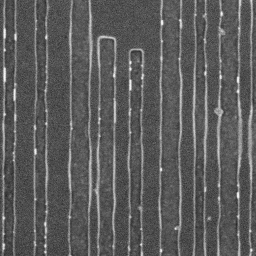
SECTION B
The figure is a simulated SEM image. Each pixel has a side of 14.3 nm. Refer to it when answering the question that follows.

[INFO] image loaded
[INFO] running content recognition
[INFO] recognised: groups of lines, slits or small figures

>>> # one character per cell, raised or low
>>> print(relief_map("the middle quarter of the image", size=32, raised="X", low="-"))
XX-----XX----XXX----XXXX-----XXX
XX-----XX----XXX----XXXX-----XXX
XX----XXX----XXX----XXXX-----XXX
XX----XXX----XXX----XXXX-----XXX
XX----XXX----XXX----XXXX-----XXX
XX----XXX----XXX----XXXX-----XXX
XX----XXX----XXX----XXXX-----XXX
XX----XXX----XXX---XXXXX-----XXX
XX----XXX----XXX----XXXX-----XXX
XX----XXX----XXX----XXXX-----XXX
XX----XXX----XXX---XXXXX-----XXX
XX----XXX----XXX---XXXXX-----XXX
XX----XXX----XXX---XXXXX-----XXX
XX----XXX----XXX---XXXXX-----XXX
XX----XXX----XXX---XXXXX-----XXX
XX----XXX----XXX---XXXXX-----XXX
XX----XXX----XXX---XXXXX-----XXX
XX----XXX----XXX---XXXXX-----XXX
XX----XXX----XXX---XXXXX-----XXX
XX-----XX----XXX---XXXXX-----XXX
XX-----XX----XXX---XXXXX-----XXX
XX-----XX----XXX----XXXX-----XXX
XX-----X-----XXX----XXXX-----XXX
XX-----X-----XXX----XXXX-----XXX
X------XX----XXX----XXXX-----XXX
X------XX----XXX----XXXX-----XXX
X------XX----XXX---XXXXX-----XXX
X------XX----XXX---XXXXX-----XXX
X------XX---XXXX---XXXXX-----XXX
X------XX---XXXX---XXXXX-----XXX
XX-----X----XXXX---XXXXX-----XXX
XX-----XX----XXX---XXXXX-----XXX